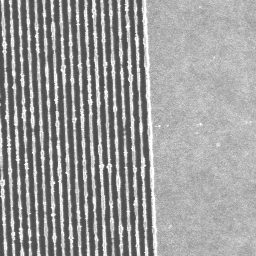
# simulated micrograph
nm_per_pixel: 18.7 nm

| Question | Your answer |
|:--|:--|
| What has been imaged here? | parallel lines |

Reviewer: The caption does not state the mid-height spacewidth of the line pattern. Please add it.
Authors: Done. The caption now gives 0.0955 µm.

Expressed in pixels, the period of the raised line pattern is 8.29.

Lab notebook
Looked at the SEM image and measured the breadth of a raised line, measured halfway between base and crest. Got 62.9 nm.